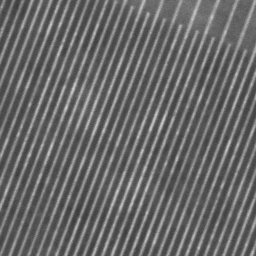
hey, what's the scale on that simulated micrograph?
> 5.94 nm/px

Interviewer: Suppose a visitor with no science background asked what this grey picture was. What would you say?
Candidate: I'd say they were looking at parallel lines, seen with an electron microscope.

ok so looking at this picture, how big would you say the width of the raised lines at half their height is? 11.8 nanometres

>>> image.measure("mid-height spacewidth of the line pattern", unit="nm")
40.2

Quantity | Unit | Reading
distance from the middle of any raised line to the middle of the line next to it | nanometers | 51.6